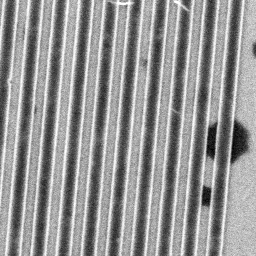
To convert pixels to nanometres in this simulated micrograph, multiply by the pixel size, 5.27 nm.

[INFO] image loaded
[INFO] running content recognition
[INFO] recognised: parallel lines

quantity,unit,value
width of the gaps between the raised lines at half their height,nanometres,49.1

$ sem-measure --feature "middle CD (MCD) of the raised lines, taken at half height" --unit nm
80.6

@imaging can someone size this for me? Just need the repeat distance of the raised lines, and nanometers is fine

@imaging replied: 132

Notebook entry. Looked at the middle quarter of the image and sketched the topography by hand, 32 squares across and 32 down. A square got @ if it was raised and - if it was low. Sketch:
--@@@@---@@@---@@@---@@@@--@@@@-
--@@@@--@@@@---@@@---@@@@--@@@@-
--@@@@--@@@@---@@@---@@@---@@@@-
--@@@@--@@@@---@@@---@@@---@@@@-
--@@@@--@@@@--@@@@---@@@---@@@--
--@@@---@@@@--@@@@---@@@---@@@--
--@@@---@@@@--@@@@--@@@@---@@@--
--@@@---@@@@--@@@@--@@@@---@@@--
-@@@@---@@@@--@@@@--@@@@---@@@--
-@@@@---@@@---@@@@--@@@@---@@@--
-@@@@---@@@---@@@@--@@@@--@@@@--
-@@@@---@@@---@@@---@@@@--@@@@--
-@@@@---@@@---@@@---@@@@--@@@@--
-@@@@--@@@@---@@@---@@@---@@@@--
-@@@@--@@@@---@@@---@@@---@@@@--
-@@@@--@@@@--@@@@---@@@---@@@@--
-@@@---@@@@--@@@@---@@@---@@@---
-@@@---@@@@--@@@@--@@@@---@@@---
-@@@---@@@@--@@@@--@@@@---@@@---
@@@@---@@@---@@@@--@@@@---@@@---
@@@@---@@@---@@@@--@@@@--@@@@---
@@@@---@@@---@@@@--@@@@--@@@@---
@@@@---@@@---@@@---@@@@--@@@@---
@@@@---@@@---@@@---@@@@--@@@@---
@@@@--@@@@---@@@---@@@---@@@@--@
@@@@--@@@@---@@@---@@@---@@@@--@
@@@@--@@@@--@@@@---@@@---@@@@--@
@@@---@@@@--@@@@---@@@---@@@@--@
@@@---@@@@--@@@@--@@@@---@@@@--@
@@@---@@@@--@@@@--@@@@---@@@---@
@@@---@@@@--@@@@--@@@@---@@@---@
@@@---@@@---@@@@--@@@@---@@@---@